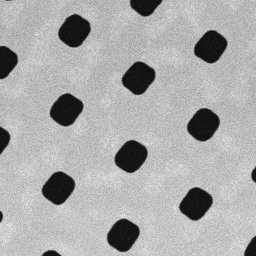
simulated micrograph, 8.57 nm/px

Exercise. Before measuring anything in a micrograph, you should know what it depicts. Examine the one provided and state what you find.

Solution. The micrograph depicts a regular array of holes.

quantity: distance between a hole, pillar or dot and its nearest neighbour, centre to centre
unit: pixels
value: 78.7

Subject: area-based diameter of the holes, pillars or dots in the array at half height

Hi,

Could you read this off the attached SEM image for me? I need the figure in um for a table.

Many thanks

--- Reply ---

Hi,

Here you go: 0.267